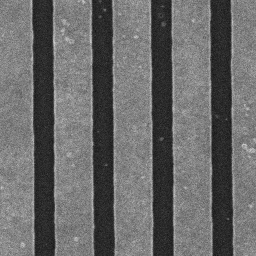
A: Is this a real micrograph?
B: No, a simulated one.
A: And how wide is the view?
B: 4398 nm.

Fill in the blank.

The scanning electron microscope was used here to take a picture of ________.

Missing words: wiring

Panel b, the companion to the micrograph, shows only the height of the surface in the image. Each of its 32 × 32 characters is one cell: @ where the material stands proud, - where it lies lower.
@@@@---@@@@---@@@@@---@@@@---@@@
@@@@---@@@@---@@@@@---@@@@---@@@
@@@@---@@@@---@@@@@---@@@@---@@@
@@@@---@@@@---@@@@@---@@@@---@@@
@@@@---@@@@---@@@@@---@@@@---@@@
@@@@---@@@@---@@@@@---@@@@---@@@
@@@@---@@@@---@@@@@---@@@@---@@@
@@@@---@@@@---@@@@@---@@@@---@@@
@@@@---@@@@---@@@@@---@@@@---@@@
@@@@---@@@@---@@@@@---@@@@---@@@
@@@@---@@@@---@@@@@---@@@@---@@@
@@@@---@@@@---@@@@@---@@@@---@@@
@@@@---@@@@---@@@@@---@@@@---@@@
@@@@---@@@@---@@@@@---@@@@---@@@
@@@@---@@@@---@@@@@---@@@@---@@@
@@@@---@@@@---@@@@@---@@@@---@@@
@@@@---@@@@---@@@@@---@@@@---@@@
@@@@---@@@@@--@@@@@---@@@@---@@@
@@@@---@@@@@--@@@@@---@@@@---@@@
@@@@---@@@@---@@@@@---@@@@---@@@
@@@@---@@@@@--@@@@@---@@@@---@@@
@@@@---@@@@@--@@@@@---@@@@---@@@
@@@@---@@@@@--@@@@@---@@@@---@@@
@@@@---@@@@@--@@@@@---@@@@---@@@
@@@@---@@@@@--@@@@@---@@@@---@@@
@@@@---@@@@@--@@@@@---@@@@---@@@
@@@@---@@@@@--@@@@@---@@@@---@@@
@@@@---@@@@@--@@@@@---@@@@---@@@
@@@@---@@@@@--@@@@@---@@@@---@@@
@@@@---@@@@@--@@@@@---@@@@---@@@
@@@@---@@@@@--@@@@@---@@@@---@@@
@@@@---@@@@@--@@@@@---@@@@---@@@